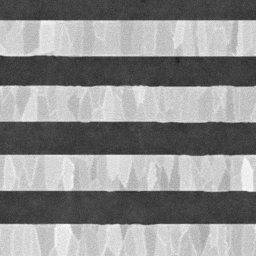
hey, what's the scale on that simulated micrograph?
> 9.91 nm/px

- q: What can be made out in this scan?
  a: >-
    lines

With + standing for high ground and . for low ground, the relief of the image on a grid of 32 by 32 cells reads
................................
................................
................................
++++++++++++++++++++++++++++++++
++++++++++++++++++++++++++++++++
++++++++++++++++++++++++++++++++
++++++++++++++++++++++++++++++++
................................
................................
................................
................................
++++++++++++++++++++++++++++++++
++++++++++++++++++++++++++++++++
++++++++++++++++++++++++++++++++
++++++++++++++++++++++++++++++++
................................
................................
................................
................................
++++++++++++++++++++++++.+++++++
++++++++++++++++++++++++++++++++
++++++++++++++++++++++++++++++++
++++++++++++++++++++++++++++++++
++++++++++++++++++++++++++++++++
................................
................................
................................
................................
++++++++++++++++++++++++++++++++
++++++++++++++++++++++++++++++++
++++++++++++++++++++++++++++++++
++++++++++++++++++++++++++++++++